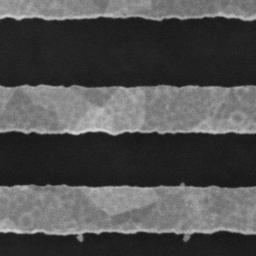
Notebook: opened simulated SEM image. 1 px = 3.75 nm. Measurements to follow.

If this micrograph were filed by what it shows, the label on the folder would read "lines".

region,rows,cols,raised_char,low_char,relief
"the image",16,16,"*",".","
****************
................
................
................
................
****************
****************
****************
................
................
................
................
****************
****************
*************..*
................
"